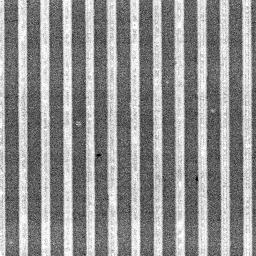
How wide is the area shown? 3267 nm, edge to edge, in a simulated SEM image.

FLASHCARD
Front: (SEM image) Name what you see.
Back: parallel lines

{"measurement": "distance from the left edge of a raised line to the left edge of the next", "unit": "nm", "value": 286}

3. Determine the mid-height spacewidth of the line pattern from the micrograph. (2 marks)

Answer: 16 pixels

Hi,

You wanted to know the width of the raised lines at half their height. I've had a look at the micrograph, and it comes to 82.9 nm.